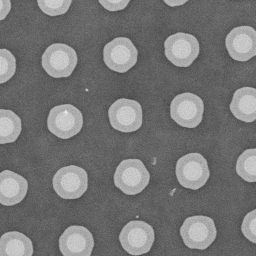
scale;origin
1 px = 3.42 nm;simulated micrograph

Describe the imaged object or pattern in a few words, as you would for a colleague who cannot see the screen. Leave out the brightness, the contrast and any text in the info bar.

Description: an array of small figures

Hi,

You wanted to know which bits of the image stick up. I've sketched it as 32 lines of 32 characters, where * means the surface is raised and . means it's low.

*....****....***.....**.........
*....***........................
................................
.............................***
.....................***....****
.......*.....****....****...****
*.....***....****....****....***
**...*****...****....***......*.
**...****.....**................
**....**........................
................................
.............................***
...............*......***....***
.......***....****...****....***
**....****....****...****....***
***...****....****....***.......
***...****......................
**..............................
................................
.......................**.....**
...............***....****....**
**.....****...*****...****....**
***....****...*****...****.....*
***....****....***.....**.......
***....***......................
**..............................
...............................*
.......................***....**
.........**....****....****...**
***.....****...****....****....*
****...*****...****....***......
****....***.....**..............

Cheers